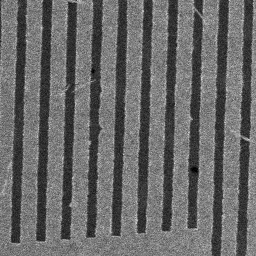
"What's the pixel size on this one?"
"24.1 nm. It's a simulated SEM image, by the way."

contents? parallel lines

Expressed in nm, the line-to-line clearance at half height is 246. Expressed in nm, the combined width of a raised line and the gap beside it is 605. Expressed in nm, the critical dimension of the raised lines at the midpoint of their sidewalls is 364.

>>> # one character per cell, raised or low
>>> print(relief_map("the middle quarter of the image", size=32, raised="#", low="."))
...####..####...###...####..####
...####..####...###...###...####
...####..####...###...###...####
...####..####...###...###...####
...####..####...###...###...####
...###...####...###...###...####
...###....###...###...###...####
...###...####...###...####..####
...###...####..####...###...####
...###...####..####...###...###.
...###...####..####...###...###.
...###...####..####...###...###.
...###...####..####...###...###.
...###...####..####...###...####
...###...####..####...###...###.
...###...####..####...###...###.
...###....##...####...###...###.
...###...###...####..####...###.
...###...###...####..####...###.
...####..###...####..####...###.
..####...###...####..####...###.
..####...###...####..####...###.
...###...###...###...####...###.
..####...###...####..####...###.
..####..####...###...####...###.
..####..####...###...####...###.
..####..####...###...####..####.
..####...###...###...####..####.
..####...###...###...####..####.
..####..####...###...####..####.
..####...###...###...####..####.
..####..####...###...####..####.